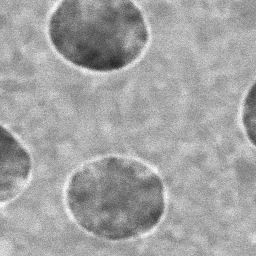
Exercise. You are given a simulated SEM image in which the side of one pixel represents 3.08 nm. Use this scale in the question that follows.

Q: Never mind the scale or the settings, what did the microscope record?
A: holes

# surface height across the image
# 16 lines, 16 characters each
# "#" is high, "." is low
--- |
###......#######
###......#######
###......#######
####.....#######
################
################
###############.
###############.
.##############.
..##############
..###....#######
..##......######
.###......######
####......######
#####....#######
################